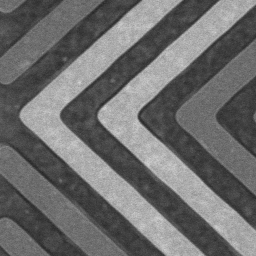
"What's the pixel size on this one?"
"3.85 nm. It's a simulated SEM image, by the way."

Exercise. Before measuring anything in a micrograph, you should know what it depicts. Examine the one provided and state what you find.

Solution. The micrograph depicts groups of lines, slits or small figures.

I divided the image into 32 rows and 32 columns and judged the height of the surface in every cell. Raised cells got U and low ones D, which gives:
UUUDDDDDUUUUDDDDDUUUUUDDDDDUUUUU
UDDDDDDUUUUDDDDDUUUUUDDDDDUUUUUD
DDDDDUUUUUDDDDDUUUUUDDDDDUUUUUDD
DDDDUUUUUDDDDDUUUUUDDDDDUUUUUDDD
DDDUUUUUDDDDDUUUUUDDDDDUUUUDDDDD
DDUUUUUDDDDDUUUUUDDDDUUUUUDDDDDU
DUUUUUDDDDDUUUUUDDDDUUUUUDDDDDUU
UUUUUDDDDUUUUUDDDDDUUUUUDDDDDUUU
UUUUDDDDUUUUUDDDDDUUUUUDDDDDUUUU
UUDDDDDUUUUUDDDDDUUUUUDDDDDUUUUU
DDDDDDUUUUUDDDDDUUUUUDDDDDUUUUUD
DDDDDUUUUUDDDDDUUUUUDDDDDUUUUUDD
DDDDUUUUUDDDDDUUUUUDDDDDUUUUUDDD
DDDUUUUUDDDDDUUUUUDDDDUUUUUUDDDD
DDDUUUUUDDDDUUUUUDDDDDUUUUUDDDDD
DDDUUUUUDDDDDUUUUUDDDDUUUUUDDDDD
DDDDUUUUUDDDDDUUUUUDDDDDUUUUDDDD
DDDDDUUUUUDDDDDUUUUUDDDDDUUUUDDD
UDDDDDUUUUUDDDDDUUUUUDDDDDUUUUDD
UUUDDDDUUUUUDDDDDUUUUUDDDDDUUUUU
UUUUDDDDUUUUUDDDDDUUUUUDDDDDUUUU
UUUUUDDDDUUUUUDDDDDUUUUUDDDDDUUU
DUUUUUDDDDUUUUUDDDDDUUUUUDDDDDUU
DDUUUUUDDDDDUUUUUDDDDUUUUUDDDDDU
DDDUUUUUDDDDDUUUUUDDDDUUUUUDDDDD
DDDDUUUUUDDDDDUUUUUDDDDUUUUUDDDD
DDDDDUUUUUDDDDDUUUUUDDDDDUUUUDDD
UDDDDDUUUUUDDDDDUUUUUDDDDDUUUUDD
UUUDDDDUUUUUDDDDDUUUUUDDDDDUUUUU
UUUUDDDDUUUUUDDDDDUUUUUDDDDDUUUU
UUUUUDDDDUUUUUDDDDDUUUUUDDDDDUUU
DUUUUUDDDDUUUUUDDDDDUUUUUDDDDDUU